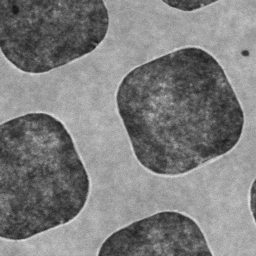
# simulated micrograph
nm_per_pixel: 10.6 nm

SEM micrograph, holes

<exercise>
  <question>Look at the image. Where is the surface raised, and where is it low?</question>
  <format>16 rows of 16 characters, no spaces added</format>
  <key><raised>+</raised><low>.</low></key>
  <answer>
.......++++..+++
.......+++++++++
......++++++++++
.....+++++...+++
++.+++++......++
+++++++........+
+++++++........+
+...++++.......+
....++++.......+
.....+++......++
.....++++...++++
......++++++++++
.....+++++++++++
.....++++...++++
...++++......+++
++++++.......+++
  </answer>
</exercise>